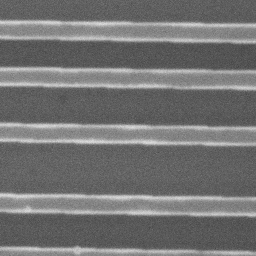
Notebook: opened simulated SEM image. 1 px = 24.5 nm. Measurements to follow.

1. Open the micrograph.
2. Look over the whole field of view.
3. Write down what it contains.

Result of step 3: lines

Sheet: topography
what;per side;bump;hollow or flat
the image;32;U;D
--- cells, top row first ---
DDDDDDDDDDDDDDDDDDDDDDDDDDDDDDDD
DDDDDDDDDDDDDDDDDDDDDDDDDDDDDDDD
DDDDDDDDDDDDDDDDDDDDDDDDDDDDDDDD
UUUUUUUUUUUUUUUUUUUUUUUUUUUUUUUU
UUUUUUUUUUUUUUUUUUUUUUUUUUUUUUUU
DDDDDDDDDDDDDDDDDDDDDDDDDDDDDDDD
DDDDDDDDDDDDDDDDDDDDDDDDDDDDDDDD
DDDDDDDDDDDDDDDDDDDDDDDDDDDDDDDD
DDDDDDDDDDDDDDDDDDDDDDDDDDDDDDDD
UUUUUUUUUUUUUUUUUUUUUUUUUUUUUUUU
UUUUUUUUUUUUUUUUUUUUUUUUUUUUUUUU
DDDDDDDDDDDDDDDDDDDDDDDDDDDDDDDD
DDDDDDDDDDDDDDDDDDDDDDDDDDDDDDDD
DDDDDDDDDDDDDDDDDDDDDDDDDDDDDDDD
DDDDDDDDDDDDDDDDDDDDDDDDDDDDDDDD
UDDDDDDDDDDDDDDDDDDDDDDDDDDDDDDD
UUUUUUUUUUUUUUUUUUUUUUUUUUUUUUUU
UUUUUUUUUUUUUUUUUUUUUUUUUUUUUUUU
DDDDDDDDDDDDDDDDDDDDDDDDDDDDDDDD
DDDDDDDDDDDDDDDDDDDDDDDDDDDDDDDD
DDDDDDDDDDDDDDDDDDDDDDDDDDDDDDDD
DDDDDDDDDDDDDDDDDDDDDDDDDDDDDDDD
DDDDDDDDDDDDDDDDDDDDDDDDDDDDDDDD
DDDDDDDDDDDDDDDDDDDDDDDDDDDDDDDD
UUUUUUUUUDDDDDDDDDDDDDDDDDDDDDDD
UUUUUUUUUUUUUUUUUUUUUUUUUUUUUUUU
DDUUUUUUUUUUUUUUUUUUUUUUUUUUUUUU
DDDDDDDDDDDDDDDDDDDDDDDDDDDDDDDD
DDDDDDDDDDDDDDDDDDDDDDDDDDDDDDDD
DDDDDDDDDDDDDDDDDDDDDDDDDDDDDDDD
DDDDDDDDDDDDDDDDDDDDDDDDDDDDDDDD
UUUUUUUUUUUUUUUUUUUUUUUUUUUUUUDD